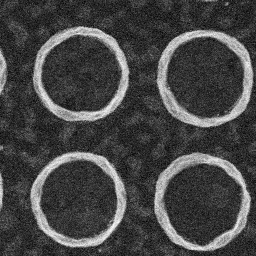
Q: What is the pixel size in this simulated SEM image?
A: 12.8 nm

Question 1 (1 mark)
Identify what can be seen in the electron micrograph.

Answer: raised bodies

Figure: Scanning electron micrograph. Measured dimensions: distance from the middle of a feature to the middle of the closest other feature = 1.58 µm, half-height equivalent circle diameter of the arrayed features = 1120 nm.